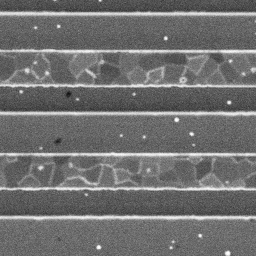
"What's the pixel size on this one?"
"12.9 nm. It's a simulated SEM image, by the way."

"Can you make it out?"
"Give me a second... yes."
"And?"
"lines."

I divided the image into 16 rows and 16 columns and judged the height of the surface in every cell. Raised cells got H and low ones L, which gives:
LLLLLLLLLLLLLLLL
LLLLLLLLLLLLLLLL
LLLLLLLLLLLLLLLL
HHHHHHHHHHHHHHHH
HHHHHHHHHHHHHHHH
LLLLLLLLLLLLLLLL
LLLLLLLLLLLLLLLL
LLLLLLLLLLLLLLLL
LLLLLLLLLLLLLLLL
LLLLLLLLLLLLLLLL
HHHHHHHHHHHHHHHH
HHHHHHHHHHHHHHHH
LLLLLLLLLLLLLLLL
LLLLLLLLLLLLLLLL
LLLLLLLLLLLLLLLL
LLLLLLLLLLLLLLLL